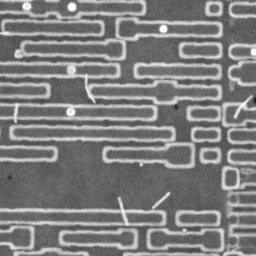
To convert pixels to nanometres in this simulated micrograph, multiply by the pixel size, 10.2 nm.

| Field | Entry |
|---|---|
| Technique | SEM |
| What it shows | wiring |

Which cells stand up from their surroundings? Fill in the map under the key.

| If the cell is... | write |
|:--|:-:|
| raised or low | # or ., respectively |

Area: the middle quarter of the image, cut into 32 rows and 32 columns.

#############.....##############
#.############....##############
##############....##############
.....#..........................
.......................#####....
.......#######################.#
......##########################
......##########################
.......#..####.#################
.......................#####....
##..............................
#######################........#
#######################........#
##.####################........#
................................
................................
###########################.....
###########################.....
###.#######################.....
................................
..........................######
..........######################
..........######################
..........######################
.........................#######
...........................#####
................................
................................
................................
................................
................................
................................